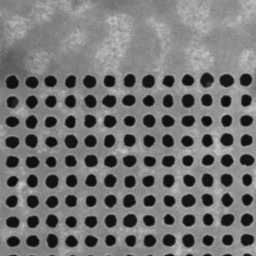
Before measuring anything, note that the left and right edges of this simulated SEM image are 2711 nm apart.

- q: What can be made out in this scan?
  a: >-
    a regular array of holes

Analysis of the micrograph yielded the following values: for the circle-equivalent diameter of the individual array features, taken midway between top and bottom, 0.131 µm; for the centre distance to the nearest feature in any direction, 203 nm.